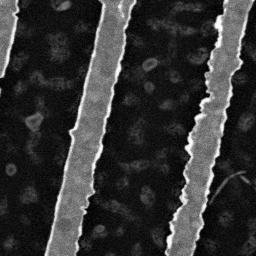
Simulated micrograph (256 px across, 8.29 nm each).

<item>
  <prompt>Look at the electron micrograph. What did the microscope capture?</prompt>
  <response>one or a few lines or trenches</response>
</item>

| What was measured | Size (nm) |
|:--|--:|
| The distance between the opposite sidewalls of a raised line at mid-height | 229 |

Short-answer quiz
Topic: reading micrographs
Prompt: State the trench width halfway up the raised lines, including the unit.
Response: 727 nanometres